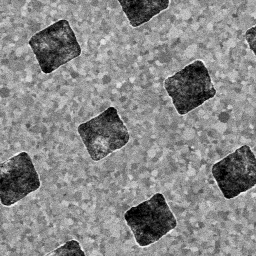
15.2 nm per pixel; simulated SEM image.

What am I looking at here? holes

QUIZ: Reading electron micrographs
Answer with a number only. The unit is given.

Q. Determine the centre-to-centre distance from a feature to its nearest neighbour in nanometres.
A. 1490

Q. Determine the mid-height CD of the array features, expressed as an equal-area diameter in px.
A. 47.6